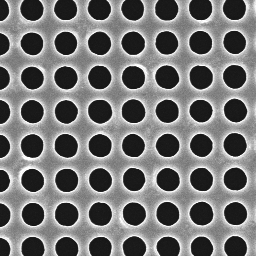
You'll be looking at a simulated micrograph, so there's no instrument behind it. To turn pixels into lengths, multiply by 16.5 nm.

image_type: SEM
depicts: a regular array of holes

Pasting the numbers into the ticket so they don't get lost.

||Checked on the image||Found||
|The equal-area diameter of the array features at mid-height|384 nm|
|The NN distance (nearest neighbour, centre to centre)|556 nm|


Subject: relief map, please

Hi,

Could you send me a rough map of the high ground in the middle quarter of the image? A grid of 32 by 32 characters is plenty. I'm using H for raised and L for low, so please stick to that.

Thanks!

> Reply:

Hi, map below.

HHHHHHHHLLHHHHHHHHHHHHHHHLLHHHHH
LLHHHHHLLLLHHHHLLLLLHHHLLLLLHHHH
LLLHHHLLLLLLHHLLLLLLHHHLLLLLLHHL
LLLLHHLLLLLLHHLLLLLLHHHLLLLLLHHL
LLLHHHLLLLLLHHHLLLLLHHHLLLLLLHHH
LLLHHHHLLLLHHHHLLLLLHHHHLLLLHHHH
LHHHHHHHHHHHHHHHHHHHHHHHHHHHHHHH
HHHHHHHHHHHHHHHHHHHHHHHHHHHHHHHH
HHHHHHHHHHHHHHHHHHHHHHHHHHHHHHHH
LLHHHHHLLLLHHHHHLLLHHHHHLLLLHHHH
LLLHHHLLLLLLHHHLLLLLHHHLLLLLHHHH
LLLHHHLLLLLLHHLLLLLLHHHLLLLLLHHL
LLLHHHLLLLLLHHHLLLLLHHHLLLLLLHHH
LLLHHHHLLLLLHHHLLLLLHHHHLLLLHHHH
LLHHHHHHLLLHHHHHLLLHHHHHLLLHHHHH
HHHHHHHHHHHHHHHHHHHHHHHHHHHHHHHH
HHHHHHHHHHHHHHHHHHHHHHHHHHHHHHHH
LHHHHHHHHHHHHHHHHHHHHHHHHLLHHHHH
LLLHHHHLLLLHHHHLLLLHHHHHLLLLHHHH
LLLHHHLLLLLLHHHLLLLLHHHLLLLLLHHH
LLLHHHLLLLLLHHLLLLLLHHHLLLLLLHHL
LLLHHHLLLLLLHHHLLLLLHHHLLLLLLHHH
LLLHHHHLLLLHHHHLLLLHHHHHLLLLHHHH
LLHHHHHHHHHHHHHHHHHHHHHHHHHHHHHH
HHHHHHHHHHHHHHHHHHHHHHHHHHHHHHHH
HHHHHHHHHHHHHHHHHHHHHHHHHHHHHHHH
LLHHHHHHLLHHHHHHLLLHHHHHLLLHHHHH
LLLHHHHLLLLHHHHLLLLLHHHLLLLLHHHH
LLLLHHLLLLLLHHHLLLLLHHHLLLLLLHHL
LLLLHHLLLLLLHHHLLLLLHHHLLLLLLHHH
LLLHHHHLLLLLHHHLLLLLHHHHLLLLHHHH
LLHHHHHHLLLHHHHHLLLHHHHHHLLLHHHH